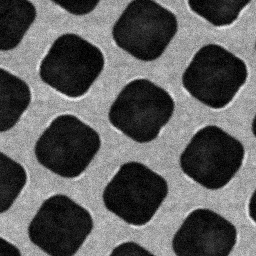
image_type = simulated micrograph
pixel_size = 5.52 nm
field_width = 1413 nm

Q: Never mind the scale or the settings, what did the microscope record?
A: holes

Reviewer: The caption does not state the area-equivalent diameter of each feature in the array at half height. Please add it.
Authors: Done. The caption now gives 0.337 µm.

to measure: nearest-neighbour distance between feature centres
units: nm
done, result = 448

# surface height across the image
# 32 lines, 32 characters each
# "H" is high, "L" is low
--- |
LLLLHHHLLLLLHHHHLLLLHHHHLLLLLLLH
LLLLLHHHHLLHHHHLLLLLLHHHLLLLLLHH
LLLLHHHHHHHHHHHLLLLLLLHHHHLLLHHH
LLLLHHHHHHHHHHLLLLLLLLHHHHHHHHHH
LLLHHHHHLLHHHHLLLLLLLLHHHHHHHHHH
LLHHHHHLLLLHHHHLLLLLLHHHHHHHHHHH
HHHHHHLLLLLLLHHHLLLLHHHHHLLLLHHH
HHHHHLLLLLLLLHHHHHLHHHHHLLLLLLHH
HHHHHLLLLLLLLHHHHHHHHHHLLLLLLLLH
LLHHHLLLLLLLHHHHHHHHHHHLLLLLLLLH
LLLHHHLLLLLLHHHHLLLHHHHLLLLLLLHH
LLLLHHHLLLLHHHHLLLLLLHHHLLLLLLHH
LLLLHHHHHHHHHHLLLLLLLLHHHLLLLHHH
LLLHHHHHHHHHHHLLLLLLLLHHHHHLHHHH
LLLHHHHLLHHHHHLLLLLLLHHHHHHHHHHH
LLHHHHLLLLLHHHLLLLLLLHHHHHHHHHHL
HHHHHLLLLLLLHHHLLLLLHHHHHLLLHHHH
HHHHHLLLLLLLLHHHHLLHHHHHLLLLLLHH
HHHHLLLLLLLLHHHHHHHHHHHLLLLLLLHH
LHHHLLLLLLLLHHHHHHHHHHHLLLLLLLLH
LLHHHLLLLLLHHHHLLLHHHHHLLLLLLLHH
LLLHHHLLLLHHHHHLLLLHHHHLLLLLLLHH
LLLHHHHHHHHHHHLLLLLLLHHHLLLLLHHH
LLLHHHHHHHHHHLLLLLLLLHHHHHLLHHHH
LLHHHHLLHHHHHLLLLLLLLHHHHHHHHHHL
LLHHHLLLLLHHHLLLLLLLHHHHHHHHHHHL
LHHHHLLLLLLHHHLLLLLLHHHHLLLHHHHL
HHHHLLLLLLLLHHHLLLLHHHHLLLLLHHHH
HHHHLLLLLLLLHHHHHHHHHHLLLLLLLHHH
HHHHLLLLLLLHHHHHHHHHHHLLLLLLLLHH
LHHHLLLLLLHHHHHLLHHHHHLLLLLLLHHH
LLHHHHLLLHHHHHLLLLLHHHLLLLLLLHHH